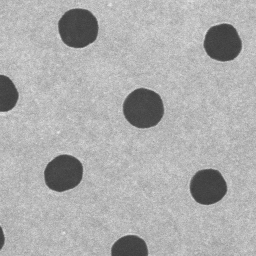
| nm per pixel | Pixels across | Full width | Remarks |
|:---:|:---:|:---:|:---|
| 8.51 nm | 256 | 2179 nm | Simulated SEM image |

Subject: holes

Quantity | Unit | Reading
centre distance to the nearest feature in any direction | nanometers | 876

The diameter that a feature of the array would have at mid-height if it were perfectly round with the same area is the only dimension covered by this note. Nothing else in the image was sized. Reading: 325 nm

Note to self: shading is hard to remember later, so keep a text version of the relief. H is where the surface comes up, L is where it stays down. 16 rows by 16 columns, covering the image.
HHHHHHHHHHHHHHHH
HHHHLLHHHHHHHHHH
HHHHLLHHHHHHHLLH
HHHHHHHHHHHHHLLH
HHHHHHHHHHHHHHHH
LHHHHHHHHHHHHHHH
LHHHHHHHLLHHHHHH
HHHHHHHHLLHHHHHH
HHHHHHHHHHHHHHHH
HHHHHHHHHHHHHHHH
HHHLLHHHHHHHHHHH
HHHLLHHHHHHHLLHH
HHHHHHHHHHHHLLHH
HHHHHHHHHHHHHHHH
HHHHHHHHHHHHHHHH
HHHHHHHLLHHHHHHH